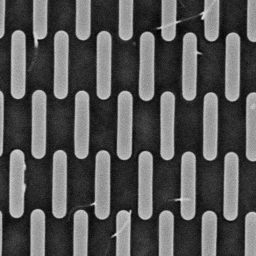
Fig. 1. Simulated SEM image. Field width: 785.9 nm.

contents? groups of lines, slits or small figures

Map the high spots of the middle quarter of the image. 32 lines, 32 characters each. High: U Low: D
UDDDDDDDUUUUDDDDDDDUUUDDDDDDDDUU
UDDDDDDDUUUUDDDDDDDUUUDDDDDDDDUU
UDDDDDDDUUUUDDDDDDDUUUDDDDDDDDUU
UDDDDDDDUUUUDDDDDDDUUUDDDDDDDDUU
UDDDDDDDUUUUDDDDDDDUUUDDDDDDDDUU
UDDDDDDDUUUUDDDDDDDUUUDDDDDDDDUU
UDDDDDDDUUUUDDDDDDDUUUDDDDDDDDUU
UDDUUUDDUUUUDDUUUDDUUUDDDUUDDDUU
DDDUUUDDDUUDDDUUUDDUUUDDUUUUDDUU
DDDUUUDDDDDDDDUUUDDDDDDDUUUUDDDD
DDDUUUDDDDDDDDUUUDDDDDDDUUUUDDDD
DDDUUUDDDDDDDDUUUDDDDDDDUUUUDDDD
DDDUUUDDDDDDDDUUUDDDDDDDUUUUDDDD
DDDUUUDDDDDDDDUUUDDDDDDDUUUDDDDD
DDDUUUDDDDDDDDUUUDDDDDDDUUUDDDDD
DDDUUUDDDDDDDDUUUDDDDDDDUUUDDDDD
DDDUUUDDDDDDDDUUUDDDDDDDUUUDDDDD
DDDUUUDDDDDDDDUUUDDDDDDDUUUDDDDD
DDDUUUDDDDDDDDUUUDDDDDDDUUUDDDDD
DDDUUUDDDDDDDDUUUDDDDDDDUUUDDDDD
DDDUUUDDDDDDDDUUUDDDDDDDUUUDDDDD
DDDUUUDDDDDDDUUUUDDDDDDDUUUDDDDD
DDDUUUDDUUUDDUUUUDDUUUDDUUUDDDUU
DDDDUDDDUUUDDDUUDDDUUUDDDUUDDDUU
DDDDDDDDUUUDDDDDDDDUUUDDDDDDDDUU
DDDDDDDDUUUDDDDDDDDUUUDDDDDDDDUU
DDDDDDDDUUUDDDDDDDDUUUDDDDDDDDUU
DDDDDDDDUUUDDDDDDDDUUUDDDDDDDDUU
DDDDDDDDUUUDDDDDDDDUUUDDDDDDDDUU
DDDDDDDDUUUDDDDDDDDUUUDDDDDDDDUU
DDDDDDDDUUUDDDDDDDDUUUDDDDDDDDUU
DDDDDDDDUUUDDDDDDDDUUUDDDDDDDUUU